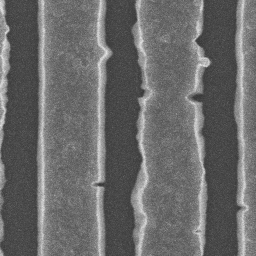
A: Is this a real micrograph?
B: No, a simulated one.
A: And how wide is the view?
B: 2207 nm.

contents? one or a few lines or trenches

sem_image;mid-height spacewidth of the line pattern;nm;328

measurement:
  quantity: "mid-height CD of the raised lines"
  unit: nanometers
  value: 524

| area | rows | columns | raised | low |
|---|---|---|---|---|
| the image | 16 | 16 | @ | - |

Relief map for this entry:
---@@@---@@@@--@
---@@@---@@@@--@
---@@@---@@@---@
---@@@@--@@@@--@
---@@@---@@@@--@
---@@@---@@@---@
---@@@---@@@---@
---@@@---@@@---@
--@@@@---@@@---@
---@@@---@@@@--@
---@@@---@@@@--@
---@@@---@@@@--@
---@@@--@@@@@--@
---@@@---@@@@--@
---@@@---@@@@--@
---@@@---@@@@--@